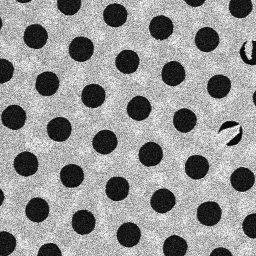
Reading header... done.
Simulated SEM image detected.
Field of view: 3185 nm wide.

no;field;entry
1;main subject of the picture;a regular array of holes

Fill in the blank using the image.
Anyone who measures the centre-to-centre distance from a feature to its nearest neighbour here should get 47.3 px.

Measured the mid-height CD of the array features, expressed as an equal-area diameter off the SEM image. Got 308 nm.